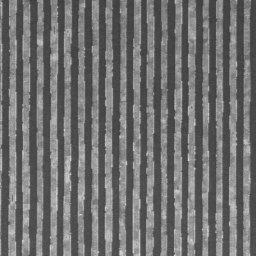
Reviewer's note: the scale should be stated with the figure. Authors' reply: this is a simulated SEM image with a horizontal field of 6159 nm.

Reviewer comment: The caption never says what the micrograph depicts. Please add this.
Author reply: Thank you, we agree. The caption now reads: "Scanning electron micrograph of parallel lines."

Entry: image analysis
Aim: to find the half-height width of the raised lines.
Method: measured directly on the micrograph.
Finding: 141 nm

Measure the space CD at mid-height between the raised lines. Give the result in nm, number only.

202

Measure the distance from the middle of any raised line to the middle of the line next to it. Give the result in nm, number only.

332